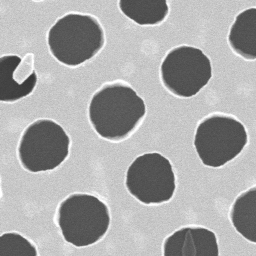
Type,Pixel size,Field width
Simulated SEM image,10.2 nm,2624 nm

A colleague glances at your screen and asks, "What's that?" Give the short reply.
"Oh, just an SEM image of holes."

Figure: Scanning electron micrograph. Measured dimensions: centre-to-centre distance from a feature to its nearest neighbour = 792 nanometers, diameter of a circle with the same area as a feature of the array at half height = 523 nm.